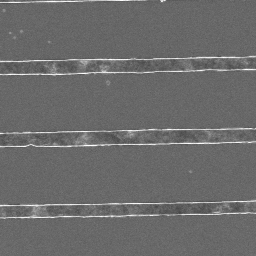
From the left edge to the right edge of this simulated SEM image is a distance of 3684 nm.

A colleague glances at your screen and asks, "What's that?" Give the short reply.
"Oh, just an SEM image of one or a few lines or trenches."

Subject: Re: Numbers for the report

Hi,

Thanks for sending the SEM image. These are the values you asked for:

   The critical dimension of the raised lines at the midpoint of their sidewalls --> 0.196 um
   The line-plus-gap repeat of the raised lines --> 1040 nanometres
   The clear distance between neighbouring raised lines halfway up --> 0.838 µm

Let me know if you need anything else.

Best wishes